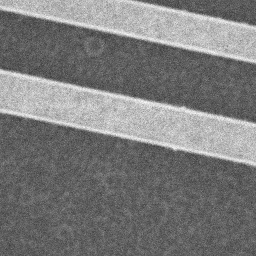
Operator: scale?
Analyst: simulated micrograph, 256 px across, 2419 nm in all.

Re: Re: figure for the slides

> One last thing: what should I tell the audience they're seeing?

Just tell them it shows one or a few lines or trenches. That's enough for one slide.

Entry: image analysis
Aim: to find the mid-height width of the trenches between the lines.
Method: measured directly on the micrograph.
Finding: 0.597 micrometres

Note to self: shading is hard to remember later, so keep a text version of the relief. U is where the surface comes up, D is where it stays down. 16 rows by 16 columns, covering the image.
UUUUUUUUUUDDDDDD
DDDDDUUUUUUUUUUD
DDDDDDDDDDUUUUUU
DDDDDDDDDDDDDDUU
DDDDDDDDDDDDDDDD
UUUUUDDDDDDDDDDD
UUUUUUUUUUDDDDDD
DDDUUUUUUUUUUUDD
DDDDDDDDUUUUUUUU
DDDDDDDDDDDDUUUU
DDDDDDDDDDDDDDDD
DDDDDDDDDDDDDDDD
DDDDDDDDDDDDDDDD
DDDDDDDDDDDDDDDD
DDDDDDDDDDDDDDDD
DDDDDDDDDDDDDDDD